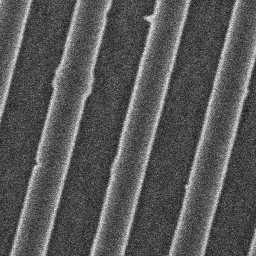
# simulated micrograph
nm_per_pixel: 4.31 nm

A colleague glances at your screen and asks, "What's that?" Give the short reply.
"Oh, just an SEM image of one or a few lines or trenches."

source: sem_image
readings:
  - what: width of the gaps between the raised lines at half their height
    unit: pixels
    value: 45.8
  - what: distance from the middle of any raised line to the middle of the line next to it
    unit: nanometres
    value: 330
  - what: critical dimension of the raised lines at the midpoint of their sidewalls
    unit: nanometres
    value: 132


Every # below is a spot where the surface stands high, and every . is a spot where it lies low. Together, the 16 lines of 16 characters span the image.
##...##...##...#
##..###..##...##
#...##...##...##
#...##...##...##
#...##...##...##
#..###..##...##.
...##...##...##.
...##...##...##.
...##...##...##.
..##...##...##..
..##...##...##..
..##...##...##..
..##...##...##..
.##...##...##...
.##...##...##...
.##...##...##...